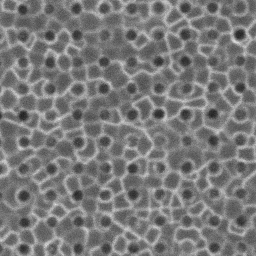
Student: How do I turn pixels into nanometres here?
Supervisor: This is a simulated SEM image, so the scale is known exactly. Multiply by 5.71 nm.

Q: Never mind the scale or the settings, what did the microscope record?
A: a regular array of raised bodies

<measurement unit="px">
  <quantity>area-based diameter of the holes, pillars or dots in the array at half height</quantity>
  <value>12.3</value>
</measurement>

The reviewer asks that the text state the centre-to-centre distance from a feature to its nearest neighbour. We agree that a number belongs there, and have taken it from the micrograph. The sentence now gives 0.0713 µm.